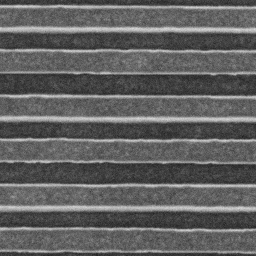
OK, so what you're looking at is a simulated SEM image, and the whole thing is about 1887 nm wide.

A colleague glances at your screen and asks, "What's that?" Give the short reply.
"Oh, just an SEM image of lines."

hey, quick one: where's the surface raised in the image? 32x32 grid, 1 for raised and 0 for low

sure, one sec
00000000000000000000000000000000
11111111111111111111111111111111
11111111111111111111111111111111
11111111111111111111111111111111
00000000000000000000000000000000
00000000000000000000000000000000
11111111111111111111111111111111
11111111111111111111111111111111
11111111111111111111111111111111
00000000000000000000000000000000
00000000000000000000000000000000
00000000000000000000000000000000
11111111111111111111111111111111
11111111111111111111111111111111
11111111111111111111111111111111
00000000000000000000000000000000
00000000000000000000000000000000
10110111100000000000000000000000
11111111111111111111111111111111
11111111111111111111111111111111
00000000000000000000000000000000
00000000000000000000000000000000
00000000000000000000000000000000
11111111111111111111111111111111
11111111111111111111111111111111
11111111111111111111111111111111
00000000000000000000000000000000
00000000000000000000000000000000
00110000010000000000000000000000
11111111111111111111111111111111
11111111111111111111111111111111
00000000000000000000000000000011